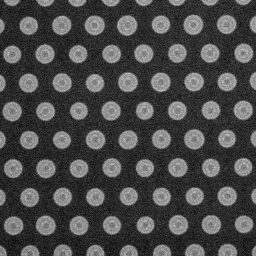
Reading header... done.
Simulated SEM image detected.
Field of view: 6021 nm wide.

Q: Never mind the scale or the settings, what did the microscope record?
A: an array of small figures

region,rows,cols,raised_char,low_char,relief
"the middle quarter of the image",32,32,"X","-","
--------------------------------
--------------------------------
---------------XX------XX-------
X-----XXX-----XXXX----XXXX-----X
XX----XXXX----XXXX----XXXX----XX
XX----XXXX----XXXX----XXXX-----X
X-----XXX------XX------XX-------
--------------------------------
--------------------------------
--------------------------------
--XXX-----XXXX-----XXX----XXXX--
--XXXX----XXXX----XXXX----XXXX--
--XXXX----XXXX----XXXX----XXXX--
---XX-----XXX------XX------XXX--
--------------------------------
--------------------------------
--------------------------------
X-----XXXX----XXXX-----XXX-----X
XX----XXXX----XXXX----XXXX----XX
XX----XXXX----XXXX----XXXX----XX
X-----XXXX----XXXX-----XXX-----X
--------------------------------
--------------------------------
--------------------------------
--XXX-----XXXX-----XXX-----XXX--
--XXXX----XXXX----XXXX----XXXXX-
--XXXX----XXXX----XXXX----XXXXX-
--XXX-----XXXX-----XXX-----XXX--
--------------------------------
--------------------------------
--------------------------------
X------XX------XXX-----XXX-----X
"